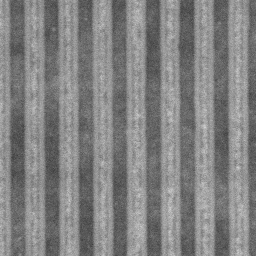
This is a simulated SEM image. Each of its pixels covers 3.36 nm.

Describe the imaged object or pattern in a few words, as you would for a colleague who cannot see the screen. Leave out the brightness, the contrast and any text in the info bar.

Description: parallel lines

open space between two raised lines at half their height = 65.9 nm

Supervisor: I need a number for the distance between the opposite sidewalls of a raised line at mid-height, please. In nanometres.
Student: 49.1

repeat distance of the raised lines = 114 nm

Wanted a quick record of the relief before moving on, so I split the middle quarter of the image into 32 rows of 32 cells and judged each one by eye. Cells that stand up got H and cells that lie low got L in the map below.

HHHLLLLLHHHLLLLLHHHHLLLLLHHHLLLL
HHHLLLLLHHHLLLLLHHHHLLLLLHHHLLLL
HHHLLLLLHHHLLLLLHHHHLLLLLHHHLLLL
HHHLLLLLHHHLLLLLHHHHLLLLLHHHLLLL
HHHLLLLLHHHLLLLLHHHHLLLLLHHHLLLL
HHHLLLLLHHHLLLLLHHHHLLLLLHHHLLLL
HHHLLLLLHHHLLLLLHHHHLLLLLHHHLLLL
HHHLLLLLHHHLLLLLHHHHLLLLLHHHLLLL
HHHLLLLLHHHLLLLLHHHHLLLLLHHHLLLL
HHHLLLLLHHHLLLLLHHHHLLLLLHHHLLLL
HHHLLLLLHHHLLLLLHHHHLLLLLHHHLLLL
HHHLLLLLHHHHLLLLHHHHLLLLLHHHLLLL
HHHLLLLLHHHHLLLLHHHHLLLLLHHHLLLL
HHHLLLLLHHHHLLLLHHHHLLLLLHHHLLLL
HHHLLLLLHHHHLLLLHHHHLLLLLHHHLLLL
HHHLLLLLHHHHLLLLHHHHLLLLLHHHLLLL
HHHLLLLLHHHHLLLLHHHHLLLLLHHHLLLL
HHHLLLLLHHHHLLLLHHHHLLLLLHHHLLLL
HHHLLLLLHHHHLLLLHHHHLLLLLHHHLLLL
HHHLLLLLHHHHLLLLHHHHLLLLLHHHLLLL
HHHLLLLLHHHLLLLLHHHHLLLLLHHHLLLL
HHHLLLLLHHHLLLLLHHHHLLLLLHHHLLLL
HHHLLLLLHHHLLLLLHHHHLLLLLHHHLLLL
HHHLLLLLHHHLLLLLHHHHLLLLLHHHLLLL
HHHLLLLLHHHHLLLLHHHHLLLLLHHHHLLL
HHHLLLLLHHHLLLLLHHHHLLLLLHHHHLLL
HHHLLLLLHHHLLLLLHHHHLLLLLHHHHLLL
HHHLLLLLHHHLLLLLLHHHLLLLLHHHHLLL
HHHLLLLLHHHLLLLLLHHHLLLLLHHHHLLL
HHHLLLLLHHHLLLLLLHHHLLLLLHHHHLLL
HHHLLLLLHHHLLLLLLHHHLLLLLHHHHLLL
HHHLLLLLHHHLLLLLLHHHLLLLLHHHHLLL